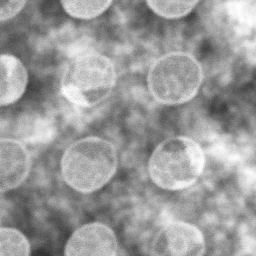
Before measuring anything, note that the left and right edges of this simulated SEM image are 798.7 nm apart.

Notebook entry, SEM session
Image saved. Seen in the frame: raised bodies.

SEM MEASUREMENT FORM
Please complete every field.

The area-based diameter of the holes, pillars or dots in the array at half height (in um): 0.163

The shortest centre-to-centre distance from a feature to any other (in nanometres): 265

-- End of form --